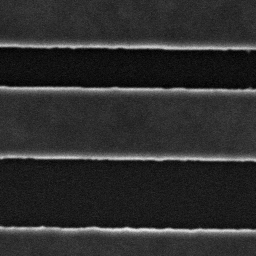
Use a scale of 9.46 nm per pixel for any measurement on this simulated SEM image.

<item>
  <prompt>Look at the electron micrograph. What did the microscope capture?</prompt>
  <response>lines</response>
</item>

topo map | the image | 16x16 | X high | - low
XXXXXXXXXXXXXXXX
XXXXXXXXXXXXXXXX
XXXXXXXXXXXXXXXX
----------------
----------------
XXXXXX-X--------
XXXXXXXXXXXXXXXX
XXXXXXXXXXXXXXXX
XXXXXXXXXXXXXXXX
XXXXXXXXXXXXXXXX
----------------
----------------
----------------
----------------
XXXXXXXXXXXXXXXX
XXXXXXXXXXXXXXXX